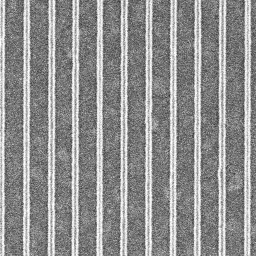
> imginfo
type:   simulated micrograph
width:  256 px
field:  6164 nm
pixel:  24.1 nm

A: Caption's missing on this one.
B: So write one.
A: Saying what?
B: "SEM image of parallel lines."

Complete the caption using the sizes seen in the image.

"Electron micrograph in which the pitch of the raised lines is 591 nm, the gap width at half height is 0.482 µm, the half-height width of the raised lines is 4.12 px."